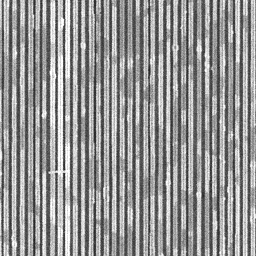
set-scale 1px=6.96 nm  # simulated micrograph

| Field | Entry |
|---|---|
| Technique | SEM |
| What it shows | parallel lines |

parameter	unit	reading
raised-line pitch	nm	53.7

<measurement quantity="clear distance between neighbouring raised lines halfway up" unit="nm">27.8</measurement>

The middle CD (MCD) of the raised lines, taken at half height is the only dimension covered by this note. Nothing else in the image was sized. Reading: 27.8 nm